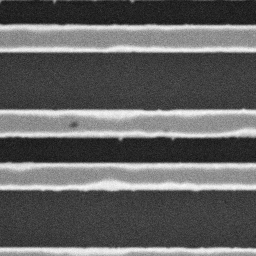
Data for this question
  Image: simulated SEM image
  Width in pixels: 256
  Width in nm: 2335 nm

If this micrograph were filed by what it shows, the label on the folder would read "lines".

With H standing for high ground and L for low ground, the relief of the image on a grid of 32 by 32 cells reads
LLLLLLLLLLLLLLLLLLLLLLLLLLLLLLLL
LLLLLLLLLLLLLLLLLLLLLLLLLLLLLLLL
LLLLLLLLLLLLLLLLLLLLLLLLLLLLLLLL
HHHHHHHHHHHHHHHHHHHHHHHHHHHHHHHH
HHHHHHHHHHHHHHHHHHHHHHHHHHHHHHHH
HHHHHHHHHHHHHHHHHHHHHHHHHHHHHHHH
LLLLLLLLLLLLLLLLLLLLLLLLLLLLLLLL
LLLLLLLLLLLLLLLLLLLLLLLLLLLLLLLL
LLLLLLLLLLLLLLLLLLLLLLLLLLLLLLLL
LLLLLLLLLLLLLLLLLLLLLLLLLLLLLLLL
LLLLLLLLLLLLLLLLLLLLLLLLLLLLLLLL
LLLLLLLLLLLLLLLLLLLLLLLLLLLLLLLL
LLLLLLLLLLLLLLLLLLLLLLLLLLLLLLLL
LLLLLLLLLLLLLLLLLLLLLLLLLLLLLLLL
HHHHHHHHHHHHHHHHHHHHHHHHHHHHHHHH
HHHHHHHHHHHHHHHHHHHHHHHHHHHHHHHH
HHHHHHHHHHHHHHHHHHHHHHHHHHHHHHHH
LLLLLLLLLLLLLLLLLLLLLLLLLLLLLLLL
LLLLLLLLLLLLLLLLLLLLLLLLLLLLLLLL
LLLLLLLLLLLLLLLLLLLLLLLLLLLLLLLL
HHHHHHHHHHHHHHHHHHHHHHHHHHHHHHHH
HHHHHHHHHHHHHHHHHHHHHHHHHHHHHHHH
HHHHHHHHHHHHHHHHHHHHHHHHHHHHHHHH
HHHHHHHHHHHHHHHHHHHHHHHHHHHHHHHH
LLLLLLLLLLLLLLLLLLLLLLLLLLLLLLLL
LLLLLLLLLLLLLLLLLLLLLLLLLLLLLLLL
LLLLLLLLLLLLLLLLLLLLLLLLLLLLLLLL
LLLLLLLLLLLLLLLLLLLLLLLLLLLLLLLL
LLLLLLLLLLLLLLLLLLLLLLLLLLLLLLLL
LLLLLLLLLLLLLLLLLLLLLLLLLLLLLLLL
LLLLLLLLLLLLLLLLLLLLLLLLLLLLLLLL
HHHHHHHHHHHHHHHHHHHHHHHHHHHHHHHH